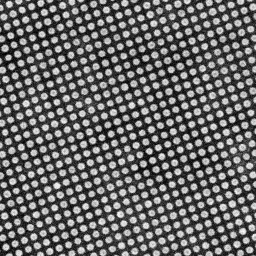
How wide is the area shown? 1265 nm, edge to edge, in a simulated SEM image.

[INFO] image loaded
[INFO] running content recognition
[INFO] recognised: a regular array of raised bodies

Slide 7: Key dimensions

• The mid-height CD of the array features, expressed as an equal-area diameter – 29.5 nm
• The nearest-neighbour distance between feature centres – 47.3 nm